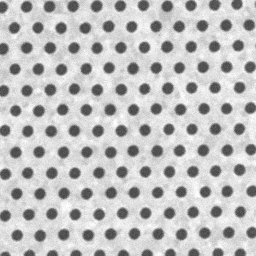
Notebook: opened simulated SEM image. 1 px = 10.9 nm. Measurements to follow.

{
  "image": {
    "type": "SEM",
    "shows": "a regular array of holes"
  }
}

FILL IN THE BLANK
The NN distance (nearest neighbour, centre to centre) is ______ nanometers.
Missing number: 251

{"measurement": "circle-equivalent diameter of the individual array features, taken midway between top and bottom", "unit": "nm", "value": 136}